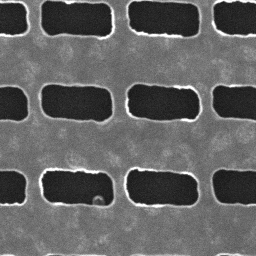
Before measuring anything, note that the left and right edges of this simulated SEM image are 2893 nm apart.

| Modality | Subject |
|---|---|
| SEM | holes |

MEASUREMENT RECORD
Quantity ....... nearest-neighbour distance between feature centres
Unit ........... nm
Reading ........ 957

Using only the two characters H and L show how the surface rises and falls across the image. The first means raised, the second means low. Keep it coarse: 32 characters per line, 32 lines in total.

LLLHHLLLLLLLLHHHLLLLLLLLHHHLLLLL
LLLHHLLLLLLLLLHHLLLLLLLLLHHLLLLL
LLLHHLLLLLLLLLHHLLLLLLLLLHHLLLLL
LLLHHLLLLLLLLLHHHLLLLLLLLHHLLLLL
HHHHHHLHHHHLLHHHHHHHHHHLHHHHHHHH
HHHHHHHHHHHHHHHHHHHHHHHHHHHHHHHH
HHHHHHHHHHHHHHHHHHHHHHHHHHHHHHHH
HHHHHHHHHHHHHHHHHHHHHHHHHHHHHHHH
HHHHHHHHHHHHHHHHHHHHHHHHHHHHHHHH
HHHHHHHHHHHHHHHHHHHHHHHHHHHHHHHH
HHHHHHLHHHHHHHHHHHHHHHHHHHHHHHHH
LLLHHLLLLLLLLLHHLLLLLLLLHHHLLLLL
LLLHHLLLLLLLLLHHLLLLLLLLLHHLLLLL
LLLHHLLLLLLLLLHHLLLLLLLLLHHLLLLL
LLLHHHLLLLLLLLHHHLLLLLLLLHHLLLLL
HHHHHHHHHHHHHHHHHHHHHHHHHHHHHHHH
HHHHHHHHHHHHHHHHHHHHHHHHHHHHHHHH
HHHHHHHHHHHHHHHHHHHHHHHHHHHHHHHH
HHHHHHHHHHHHHHHHHHHHHHHHHHHHHHHH
HHHHHHHHHHHHHHHHHHHHHHHHHHHHHHHH
HHHHHHHHHHHHHHHHHHHHHHHHHHHHHHHH
LLHHHHLLLLLHHHHHLLLLLHHHHHHLLLLL
LLLHHLLLLLLLLLHHLLLLLLLLHHHLLLLL
LLLHHLLLLLLLLLHHLLLLLLLLLHHLLLLL
LLLHHLLLLLLLLLHHLLLLLLLLLHHLLLLL
HHHHHHHHLLLLLLHHHLLLLLLLHHHHHHLL
HHHHHHHHHHHHHHHHHHHHHHHHHHHHHHHH
HHHHHHHHHHHHHHHHHHHHHHHHHHHHHHHH
HHHHHHHHHHHHHHHHHHHHHHHHHHHHHHHH
HHHHHHHHHHHHHHHHHHHHHHHHHHHHHHHH
HHHHHHHHHHHHHHHHHHHHHHHHHHHHHHHH
HHHHHHHHHHHHHHHHHHHHHHHHHHHHHHHH